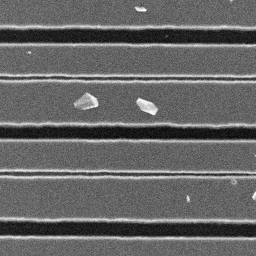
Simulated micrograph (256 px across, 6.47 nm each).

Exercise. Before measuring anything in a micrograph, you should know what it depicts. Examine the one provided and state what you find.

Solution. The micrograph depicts lines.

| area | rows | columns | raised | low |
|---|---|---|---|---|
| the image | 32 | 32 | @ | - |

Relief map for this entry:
@@@@@@@@@@@@@@@@@@@@@@@@@@@@@@@@
@@@@@@@@@@@@@@@@@@@@@@@@@@@@@@@@
@@@@@@@@@@@@@@@@@@@@@@@@@@@@@@@@
--------------------------------
--------------------------------
--------------------------------
@@@@@@@@@@@@@@@@@@@@@@@@@@@@@@@@
@@@@@@@@@@@@@@@@@@@@@@@@@@@@@@@@
@@@@@@@@@@@@@@@@@@@@@@@@@@@@@@@@
@@@@@@@@@@@@@@@@@@@@@@@@@@@@@@@@
@@@@@@@@@@@@@@@@@@@@@@@@@@@@@@@@
@@@@@@@@@@@@@@@@@@@@@@@@@@@@@@@@
@@@@@@@@@@@@@@@@@@@@@@@@@@@@@@@@
@@@@@@@@@@@@@@@@@@@@@@@@@@@@@@@@
@@@@@@@@@@@@@@@@@@@@@@@@@@@@@@@@
-@@@@@@@-@@@@@@@@@@@-@@@@@@@@@@@
--------------------------------
--------------------------------
@@@@@@@@@@@@@@@@@@@@@@@@@@@@@@@@
@@@@@@@@@@@@@@@@@@@@@@@@@@@@@@@@
@@@@@@@@@@@@@@@@@@@@@@@@@@@@@@@@
@@@@@@@@@@@@@@@@@@@@@@@@@@@@@@@@
@@@@@@@@@@@@@@@@@@@@@@@@@@@@@@@@
@@@@@@@@@@@@@@@@@@@@@@@@@@@@@@@@
@@@@@@@@@@@@@@@@@@@@@@@@@@@@@@@@
@@@@@@@@@@@@@@@@@@@@@@@@@@@@@@@@
@@@@@@@@@@@@@@@@@@@@@@@@@@@@@@@@
----@@@@-@@@@@@@@@@@@@@@@@@@@@@@
--------------------------------
--------------------------------
@@@@@@@@@@@@@@@@@@@@@@@@@@@@@@@@
@@@@@@@@@@@@@@@@@@@@@@@@@@@@@@@@